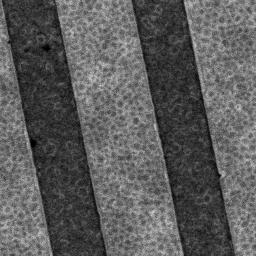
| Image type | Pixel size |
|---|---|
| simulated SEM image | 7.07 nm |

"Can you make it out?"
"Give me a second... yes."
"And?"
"one or a few lines or trenches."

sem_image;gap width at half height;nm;366